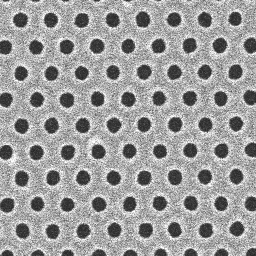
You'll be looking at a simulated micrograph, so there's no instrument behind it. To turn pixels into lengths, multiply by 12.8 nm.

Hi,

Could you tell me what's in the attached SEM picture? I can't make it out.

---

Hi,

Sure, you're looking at a regular array of holes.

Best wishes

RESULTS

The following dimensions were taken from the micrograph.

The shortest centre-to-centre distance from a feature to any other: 384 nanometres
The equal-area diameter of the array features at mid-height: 0.193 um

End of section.